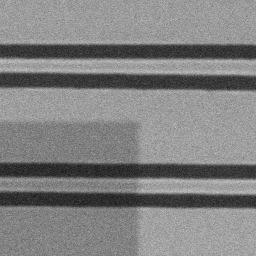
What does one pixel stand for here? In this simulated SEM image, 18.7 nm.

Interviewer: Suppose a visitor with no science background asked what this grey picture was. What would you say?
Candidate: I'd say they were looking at lines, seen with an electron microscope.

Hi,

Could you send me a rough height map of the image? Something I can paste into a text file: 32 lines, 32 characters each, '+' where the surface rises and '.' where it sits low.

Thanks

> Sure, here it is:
++++++++++++++++++++++++++++++++
++++++++++++++++++++++++++++++++
++++++++++++++++++++++++++++++++
++++++++++++++++++++++++++++++++
++++++++++++++++++++++++++++++++
................................
................................
++++++++++++++++.......+........
++++++++++++++++++++++++++++++++
................................
................................
++++++++++++++++++++++++++++++++
++++++++++++++++++++++++++++++++
++++++++++++++++++++++++++++++++
++++++++++++++++++++++++++++++++
++++++++++++++++++++++++++++++++
++++++++++++++++++++++++++++++++
++++++++++++++++++++++++++++++++
++++++++++++++++++++++++++++++++
++++++++++++++++++++++++++++++++
................................
................................
++++++++++++++++++++++++++++++..
++++++++++++++++++++++++++++++++
................................
................................
++++++++++++++++++++++++++++++++
++++++++++++++++++++++++++++++++
++++++++++++++++++++++++++++++++
++++++++++++++++++++++++++++++++
++++++++++++++++++++++++++++++++
++++++++++++++++++++++++++++++++